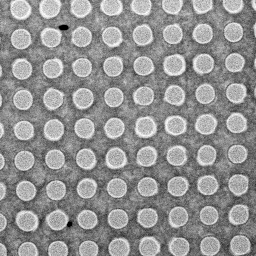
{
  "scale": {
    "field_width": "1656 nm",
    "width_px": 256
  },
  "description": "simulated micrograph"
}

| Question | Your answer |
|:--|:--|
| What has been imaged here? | an array of small figures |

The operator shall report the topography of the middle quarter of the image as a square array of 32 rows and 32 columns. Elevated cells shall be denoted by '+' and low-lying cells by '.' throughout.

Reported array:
..+++++...+++++...++++...+++++..
..+++++...+++++...++++....+++...
...+++.....+++.....++...........
................................
................................
................................
....++.....+++....++++....++++..
...++++...+++++...++++...+++++..
...++++...+++++...++++...+++++..
...++++...++++....++++....+++...
....++......+...................
................................
................................
...........................++...
...++++....++++...++++....++++..
...++++...+++++...+++++...++++..
...++++...+++++...+++++...++++..
...++++....+++.....+++.....++...
................................
................................
................................
....++......++.....+++....++++..
...++++....++++...+++++...++++..
...+++++...++++...+++++...++++..
...+++++...++++....++++...++++..
....+++.....++......+...........
................................
................................
....................+......+++..
....+++....++++....++++...+++++.
....++++...+++++...++++...+++++.
...+++++...+++++...++++...+++++.